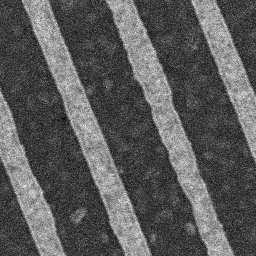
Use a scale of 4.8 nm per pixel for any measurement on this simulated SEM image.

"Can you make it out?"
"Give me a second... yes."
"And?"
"one or a few lines or trenches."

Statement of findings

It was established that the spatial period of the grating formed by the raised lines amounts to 375 nanometers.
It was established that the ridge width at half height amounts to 105 nm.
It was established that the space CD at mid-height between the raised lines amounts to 269 nanometers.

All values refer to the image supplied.